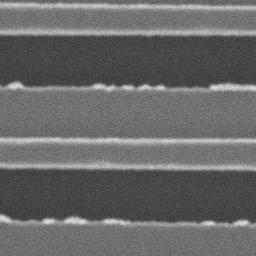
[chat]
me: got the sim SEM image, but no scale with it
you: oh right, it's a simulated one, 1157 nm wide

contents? lines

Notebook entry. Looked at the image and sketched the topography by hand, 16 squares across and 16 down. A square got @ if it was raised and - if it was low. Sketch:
@@@@@@@@@@@@@@@@
@@@@@@@@@@@@@@@@
----------------
----------------
----------------
@@@@@@@@@@@-@@@@
@@@@@@@@@@@@@@@@
@@@@@@@@@@@@@@@@
@@@@@@@@@@@@@@@@
@@@@@@@@@@@@@@@@
--------@@@@@@@@
----------------
----------------
----------------
@@@@@@@@@@@@@@@@
@@@@@@@@@@@@@@@@